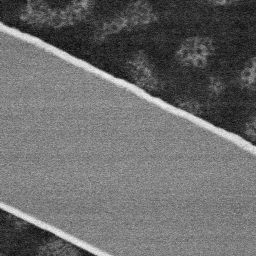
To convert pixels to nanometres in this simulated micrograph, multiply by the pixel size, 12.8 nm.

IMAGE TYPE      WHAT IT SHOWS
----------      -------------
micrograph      one or a few lines or trenches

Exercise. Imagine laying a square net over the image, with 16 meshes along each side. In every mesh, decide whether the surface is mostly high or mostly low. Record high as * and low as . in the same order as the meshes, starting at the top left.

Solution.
................
................
**..............
****............
******..........
********........
**********......
************....
**************..
****************
****************
****************
****************
.***************
....************
.....***********